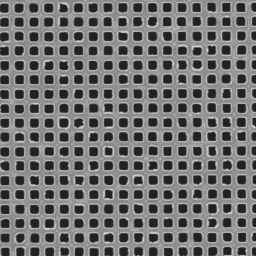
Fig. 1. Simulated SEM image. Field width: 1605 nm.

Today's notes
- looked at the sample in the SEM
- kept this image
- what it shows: a regular array of holes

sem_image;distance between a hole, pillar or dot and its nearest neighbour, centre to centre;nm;88.5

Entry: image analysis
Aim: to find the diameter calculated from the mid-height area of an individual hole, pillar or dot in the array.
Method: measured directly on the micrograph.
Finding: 0.0604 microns